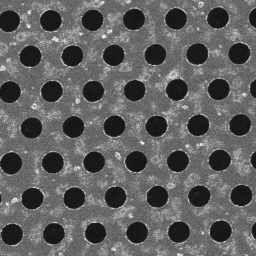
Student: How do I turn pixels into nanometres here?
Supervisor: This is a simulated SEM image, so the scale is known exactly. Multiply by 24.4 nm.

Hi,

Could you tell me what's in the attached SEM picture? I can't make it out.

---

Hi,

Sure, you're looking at a regular array of holes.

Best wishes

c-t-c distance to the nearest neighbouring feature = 0.999 micrometres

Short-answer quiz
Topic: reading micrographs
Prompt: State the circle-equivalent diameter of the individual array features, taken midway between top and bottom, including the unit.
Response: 535 nm